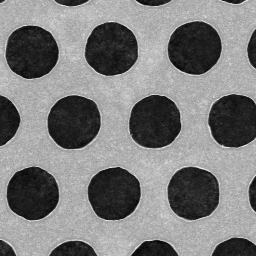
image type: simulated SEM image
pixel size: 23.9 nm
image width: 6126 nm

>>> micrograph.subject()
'a regular array of holes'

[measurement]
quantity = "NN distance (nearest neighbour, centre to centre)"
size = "1930 nm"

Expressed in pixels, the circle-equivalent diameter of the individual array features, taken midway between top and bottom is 53.7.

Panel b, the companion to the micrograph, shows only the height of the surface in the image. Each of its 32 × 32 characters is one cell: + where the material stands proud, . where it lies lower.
+++++++...++++++++...++++++++.++
++++++++++++++++++++++++++++++++
++++++++++++++++++++++++++++++++
++...+++++++....++++++.....+++++
+......++++......++++......++++.
+......++++......++++.......+++.
+......++++......++++.......+++.
+......++++......++++......++++.
+......+++++....++++++....++++++
++...+++++++++++++++++++++++++++
++++++++++++++++++++++++++++++++
++++++++++++++++++++++++++++++++
.+++++++....++++++...++++++.....
..++++......+++++.....++++......
..++++......++++.......+++......
..++++.......+++.......+++......
..++++......++++......++++......
.++++++.....+++++.....+++++.....
++++++++..+++++++++.++++++++++++
++++++++++++++++++++++++++++++++
++++++++++++++++++++++++++++++++
++....++++++....++++++....++++++
+......++++......++++......+++++
+......++++.......+++......++++.
+......++++.......+++......++++.
+......++++......++++......++++.
++....++++++.....+++++.....+++++
+++.++++++++++.+++++++++++++++++
++++++++++++++++++++++++++++++++
++++++++++++++++++++++++++++++++
.+++++++...+++++++...++++++.....
..++++......+++++.....+++++.....